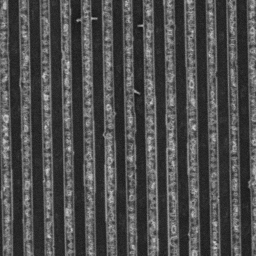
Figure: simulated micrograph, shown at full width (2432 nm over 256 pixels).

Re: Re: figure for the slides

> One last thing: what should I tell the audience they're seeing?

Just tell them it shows parallel lines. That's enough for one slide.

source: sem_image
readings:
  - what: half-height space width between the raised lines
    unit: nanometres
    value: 104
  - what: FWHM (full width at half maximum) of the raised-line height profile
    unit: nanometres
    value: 94.9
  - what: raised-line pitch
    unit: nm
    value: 197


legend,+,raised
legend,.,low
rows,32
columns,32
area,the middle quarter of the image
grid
++...++...++...++...++...+++...+
++...++...++...++...++...+++...+
++...++...++...++...++...+++...+
++...++...++...++...+++...++...+
++...++...++...++...+++...++...+
++...++...++...++...+++...++...+
++...++...++...+++..+++...++...+
++...++...++...+++..+++...++...+
++...++...++...++...+++...++...+
++...++...++...++...+++...++...+
++...++...++...++...+++...++...+
++...++...++...++...+++...++...+
++...++...+++..+++..+++...++...+
++...++...++...+++..+++...++...+
++...++...++...+++..+++...++...+
++...++...++...+++..+++...++...+
++...++...+++...++...++...++...+
++...++...+++...++...++...++...+
++...++...+++...++...++...++...+
++...++...+++...++...++...++...+
++...++...+++...++...++...++...+
++...++...+++...++...++...++...+
++...++...+++...++...++...++...+
++...++...+++...++...++...++...+
++...++...+++...++...++...++...+
++...++...+++...++...++...++...+
++...++...+++...++...++...++...+
++...++...+++...++...++...++...+
++...+++..+++...++...++...++...+
++...+++...++...++...++...++...+
++...+++...++...++...++...++...+
++...+++...++...++...++...++...+